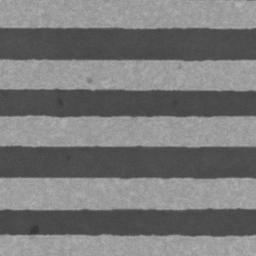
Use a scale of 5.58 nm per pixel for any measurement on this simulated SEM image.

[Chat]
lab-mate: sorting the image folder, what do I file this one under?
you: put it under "lines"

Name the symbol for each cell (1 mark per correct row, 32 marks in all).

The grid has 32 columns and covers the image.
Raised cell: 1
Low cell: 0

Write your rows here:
11111111111111111111111111111111
11111111111111111111111111111111
11111111111111111111111111111111
00000000001000011111011000111111
00000000000000000000000000000000
00000000000000000000000000000000
00000000000000000000000000000000
00000000000000000000000000000000
11111111111111111111111111111111
11111111111111111111111111111111
11111111111111111111111111111111
00000000000000000000000000000000
00000000000000000000000000000000
00000000000000000000000000000000
00000000000000000000000000000000
11111111111111111111111111111111
11111111111111111111111111111111
11111111111111111111111111111111
00000000000000000000000000000000
00000000000000000000000000000000
00000000000000000000000000000000
00000000000000000000000000000000
11111111111111111111111111111111
11111111111111111111111111111111
11111111111111111111111111111111
11111111111111111111111111111111
00000000000000000000000000000000
00000000000000000000000000000000
00000000000000000000000000000000
11111111111111100101011000000001
11111111111111111111111111111111
11111111111111111111111111111111